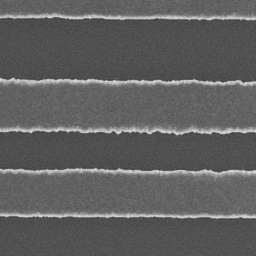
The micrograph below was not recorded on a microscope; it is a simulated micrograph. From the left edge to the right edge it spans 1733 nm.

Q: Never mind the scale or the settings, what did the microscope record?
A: lines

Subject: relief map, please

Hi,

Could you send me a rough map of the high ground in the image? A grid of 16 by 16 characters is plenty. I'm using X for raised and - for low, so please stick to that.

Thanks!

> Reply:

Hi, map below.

XXXXXXXXXXXXXXXX
----------------
----------------
----------------
----------------
XXXXXXXXXXXXXXXX
XXXXXXXXXXXXXXXX
XXXXXXXXXXXXXXXX
----------------
----------------
----------------
XXXXXXXXXXXXXXXX
XXXXXXXXXXXXXXXX
-X-XXXXXXXXXXXXX
----------------
----------------